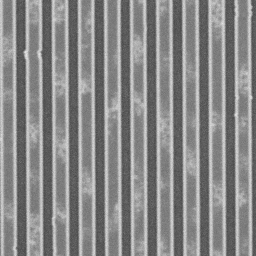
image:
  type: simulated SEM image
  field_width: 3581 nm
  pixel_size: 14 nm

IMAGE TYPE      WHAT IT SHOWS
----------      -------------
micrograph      parallel lines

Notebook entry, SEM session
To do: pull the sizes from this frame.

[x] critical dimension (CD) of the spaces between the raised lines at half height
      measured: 0.17 µm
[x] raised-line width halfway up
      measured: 191 nm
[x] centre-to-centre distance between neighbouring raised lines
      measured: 366 nanometres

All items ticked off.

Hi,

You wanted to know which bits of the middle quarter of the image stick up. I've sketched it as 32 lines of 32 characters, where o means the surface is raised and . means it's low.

o...ooo....ooo...ooo....ooo...oo
o...ooo....ooo...ooo....ooo...oo
o...ooo....ooo...ooo....ooo...oo
o...ooo....ooo...ooo....ooo...oo
o...ooo....ooo...ooo....ooo...oo
o...ooo....ooo...ooo....ooo...oo
o...ooo....ooo...ooo....ooo...oo
o...ooo....ooo...ooo....ooo...oo
o...ooo....ooo...ooo....ooo...oo
o...ooo....ooo...ooo....ooo...oo
o...ooo....ooo...ooo....ooo...oo
o...ooo....ooo...ooo....ooo...oo
o...ooo....ooo...ooo....ooo...oo
o...ooo....ooo...ooo....ooo...oo
o...ooo....ooo...ooo....ooo...oo
o...ooo....ooo...ooo....ooo...oo
o...ooo....ooo...ooo....ooo...oo
o...ooo....ooo...ooo....ooo...oo
o...ooo....ooo...ooo....ooo...oo
o...ooo....ooo...ooo....ooo...oo
o...ooo....ooo...ooo....ooo...oo
o...ooo....ooo...ooo....ooo...oo
o...ooo....ooo...ooo....ooo...oo
o...ooo....ooo...ooo....ooo...oo
o...ooo....ooo...ooo....ooo...oo
o...ooo....ooo...ooo....ooo...oo
o...ooo....ooo...ooo....ooo...oo
o...ooo....ooo...ooo....ooo...oo
o...ooo....ooo...ooo....ooo...oo
o...ooo....ooo...ooo....ooo...oo
o...ooo....ooo...ooo....ooo...oo
o...ooo....ooo...ooo....ooo...oo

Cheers